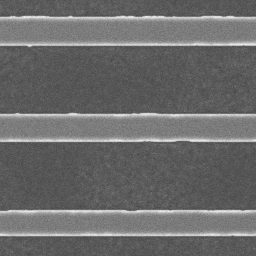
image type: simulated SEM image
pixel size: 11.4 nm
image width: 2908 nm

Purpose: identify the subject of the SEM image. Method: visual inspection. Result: lines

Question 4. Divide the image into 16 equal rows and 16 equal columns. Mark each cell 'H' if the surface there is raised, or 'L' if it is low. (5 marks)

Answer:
LLLLLLLLLLLLLLLL
HHHHHHHHHHHHHHHH
HHHHHHHHHHHHHHHH
LLLLLLLLLLLLLLLL
LLLLLLLLLLLLLLLL
LLLLLLLLLLLLLLLL
LLLLLLLLLLLLLLLL
HHHHHHHHHHHHHHHH
HHHHHHHHHHHHHHHH
LLLLLLLLLLLLLLLL
LLLLLLLLLLLLLLLL
LLLLLLLLLLLLLLLL
LLLLLLLLLLLLLLLL
HHHHHHHHHHHHHHHH
HHHHHHHHHHHHHHHH
LLLLLLLLLLLLLLLL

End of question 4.